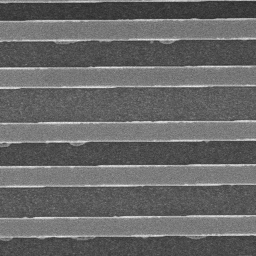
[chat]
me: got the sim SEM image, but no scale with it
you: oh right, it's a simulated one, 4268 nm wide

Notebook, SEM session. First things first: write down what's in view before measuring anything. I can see lines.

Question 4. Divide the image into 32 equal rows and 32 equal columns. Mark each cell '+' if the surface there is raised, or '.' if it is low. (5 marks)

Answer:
................................
................................
..............++++++++++++++++++
++++++++++++++++++++++++++++++++
++++++++++++++++++++++++++++++++
................................
................................
................................
...........+++++++++++++++++++++
++++++++++++++++++++++++++++++++
++++++++++++++++++++++++++++++++
................................
................................
................................
................................
++++++++++++++++++++++++++++++++
++++++++++++++++++++++++++++++++
++++++++++++++++++++++++++++++++
................................
................................
................................
++++++++++++++++++++++++++++++++
++++++++++++++++++++++++++++++++
................................
................................
................................
................................
++++++++++++++++++++++++++++++++
++++++++++++++++++++++++++++++++
+++++++++++++++++++++...........
................................
................................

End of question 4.